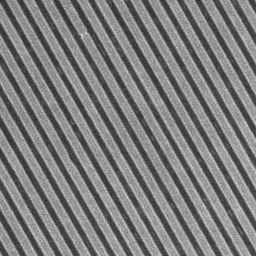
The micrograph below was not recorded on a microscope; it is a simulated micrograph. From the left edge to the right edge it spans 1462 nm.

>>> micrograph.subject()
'parallel lines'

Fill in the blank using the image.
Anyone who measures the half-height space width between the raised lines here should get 38.4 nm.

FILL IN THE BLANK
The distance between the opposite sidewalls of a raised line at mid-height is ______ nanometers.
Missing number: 49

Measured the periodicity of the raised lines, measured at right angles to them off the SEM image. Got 88.3 nm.